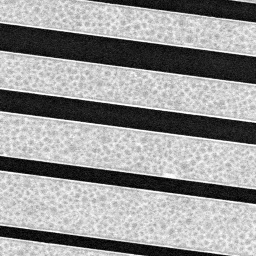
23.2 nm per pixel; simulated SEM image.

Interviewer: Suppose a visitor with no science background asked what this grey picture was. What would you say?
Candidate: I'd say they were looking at one or a few lines or trenches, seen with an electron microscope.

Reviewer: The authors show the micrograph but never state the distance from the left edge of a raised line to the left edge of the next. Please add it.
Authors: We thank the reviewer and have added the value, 1470 nanometers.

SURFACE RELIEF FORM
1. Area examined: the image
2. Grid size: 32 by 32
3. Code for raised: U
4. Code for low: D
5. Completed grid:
UUUUUUUUUUUUUDDDDDDDDDDDDDDDDDDD
UUUUUUUUUUUUUUUUUUUUUDDDDDDDDDDD
UUUUUUUUUUUUUUUUUUUUUUUUUUUUDDDD
DDDDDUUUUUUUUUUUUUUUUUUUUUUUUUUU
DDDDDDDDDDDDDUUUUUUUUUUUUUUUUUUU
DDDDDDDDDDDDDDDDDDDDDUUUUUUUUUUU
DDDDDDDDDDDDDDDDDDDDDDDDDDDDUUUU
UUUUUUUUDDDDDDDDDDDDDDDDDDDDDDDD
UUUUUUUUUUUUUUUDDDDDDDDDDDDDDDDD
UUUUUUUUUUUUUUUUUUUUUUUDDDDDDDDD
UUUUUUUUUUUUUUUUUUUUUUUUUUUUUUUD
DDDDUUUUUUUUUUUUUUUUUUUUUUUUUUUU
DDDDDDDDDDDUUUUUUUUUUUUUUUUUUUUU
DDDDDDDDDDDDDDDDDDUUUUUUUUUUUUUU
UUUDDDDDDDDDDDDDDDDDDDDDDDUUUUUU
UUUUUUUUUUUUDDDDDDDDDDDDDDDDDDDD
UUUUUUUUUUUUUUUUUUUDDDDDDDDDDDDD
UUUUUUUUUUUUUUUUUUUUUUUUUUDDDDDD
UUUUUUUUUUUUUUUUUUUUUUUUUUUUUUUU
DUUUUUUUUUUUUUUUUUUUUUUUUUUUUUUU
DDDDDDDDUUUUUUUUUUUUUUUUUUUUUUUU
UDDDDDDDDDDDDDDDUUUUUUUUUUUUUUUU
UUUUUUUUDDDDDDDDDDDDDDDDUUUUUUUU
UUUUUUUUUUUUUUUUDDDDDDDDDDDDDDDU
UUUUUUUUUUUUUUUUUUUUUUUDDDDDDDDD
UUUUUUUUUUUUUUUUUUUUUUUUUUUUUUUD
UUUUUUUUUUUUUUUUUUUUUUUUUUUUUUUU
UUUUUUUUUUUUUUUUUUUUUUUUUUUUUUUU
DDDUUUUUUUUUUUUUUUUUUUUUUUUUUUUU
DDDDDDDDDDDUUUUUUUUUUUUUUUUUUUUU
UUUUUUDDDDDDDDDDDDDUUUUUUUUUUUUU
UUUUUUUUUUUUUUDDDDDDDDDDDDUUUUUU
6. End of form